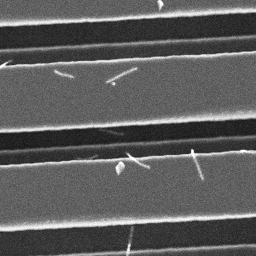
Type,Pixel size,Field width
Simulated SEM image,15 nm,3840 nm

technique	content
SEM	lines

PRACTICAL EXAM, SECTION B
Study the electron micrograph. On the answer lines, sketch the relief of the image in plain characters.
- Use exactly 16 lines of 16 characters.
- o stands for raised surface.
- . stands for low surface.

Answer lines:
oooooooooooooooo
ooo.............
................
...........ooooo
oooooooooooooooo
oooooooooooooooo
oooooooooooooooo
ooooooooooooo...
................
..............oo
oooooooooooooooo
oooooooooooooooo
oooooooooooooooo
oooooooooooooooo
................
................